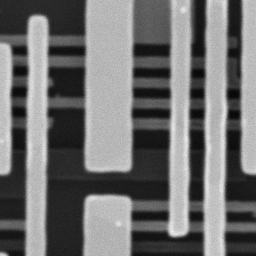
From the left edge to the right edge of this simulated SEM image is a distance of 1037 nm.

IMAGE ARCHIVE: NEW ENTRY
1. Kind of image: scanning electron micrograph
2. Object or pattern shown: wiring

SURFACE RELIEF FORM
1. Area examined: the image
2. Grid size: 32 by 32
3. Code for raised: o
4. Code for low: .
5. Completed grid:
...........oooooo....ooo..oo..oo
...........ooooo......oo..oo..oo
....oo.....ooooo.....ooo..oo..oo
...ooo.....ooooo.....ooo..oo..oo
...ooo.....ooooo......oo..oo..oo
o..ooo.....oooooo....ooo..oo..oo
o..ooo.....ooooo.....ooo..oo..oo
o...oo.....ooooo.....ooo..oo..oo
o...oo.....ooooo.....ooo..oo..oo
o...oo.....ooooo.....ooo..oo..oo
o..ooo.....ooooo.....ooo..oo..oo
o..ooo.....ooooo.....ooo..oo..oo
o..ooo.....ooooo.....ooo..oo..oo
o..ooo.....ooooo.....ooo..oo..oo
o..ooo.....ooooo.....ooo..oo..oo
o..ooo.....ooooo.....ooo..oo..oo
o..ooo.....ooooo.....ooo..oo..oo
o..ooo.....ooooo.....ooo..oo..oo
o..ooo.....ooooo.....ooo..oo..oo
o..ooo.....ooooo.....ooo..oo..oo
o..ooo.....ooooo.....ooo..oo..oo
o..ooo...............ooo..oo...o
...ooo...............ooo..oo....
...ooo...............ooo..oo....
...ooo.....oooo......ooo..oo....
...ooo.....ooooo.....ooo..oo....
...ooo.....ooooo.....ooo..oo....
...ooo.....ooooo.....ooo..oo....
...ooo.....ooooo.....ooo..oo....
...ooo.....ooooo.....oo...oo....
...ooo.....ooooo..........oo....
...ooo.....ooooo..........oo....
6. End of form